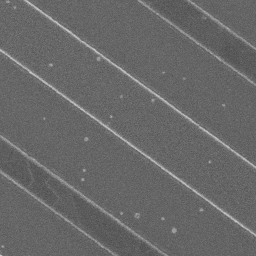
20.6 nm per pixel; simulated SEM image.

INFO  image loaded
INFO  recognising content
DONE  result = lines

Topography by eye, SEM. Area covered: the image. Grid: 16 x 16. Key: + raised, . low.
++.......+++....
++++.......+++..
+++++.......+++.
++++++.......+++
..++++++.......+
...++++++.......
.....++++++.....
......++++++....
.......++++++...
+........++++++.
+++.......++++++
.+++.......+++++
..++++.......+++
....+++.......++
.....+++........
.......+++......